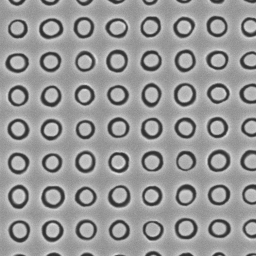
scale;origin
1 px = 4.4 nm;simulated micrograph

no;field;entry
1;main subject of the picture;a regular array of ring-shaped grooves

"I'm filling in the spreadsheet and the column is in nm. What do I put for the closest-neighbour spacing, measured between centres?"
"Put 145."